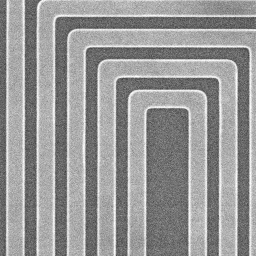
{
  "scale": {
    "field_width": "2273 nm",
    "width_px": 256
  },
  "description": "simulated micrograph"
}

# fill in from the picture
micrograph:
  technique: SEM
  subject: groups of lines, slits or small figures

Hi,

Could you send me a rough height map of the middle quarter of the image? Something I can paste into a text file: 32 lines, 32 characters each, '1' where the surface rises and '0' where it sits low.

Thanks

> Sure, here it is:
01111000011111111111111111111111
01111000011111111111111111111111
01111000011111111111111111111111
01111000011111000000000000000000
01111000011110000000000000000000
01111000011110000000000000000000
01111000011110000000000000000000
01111000011110000111111111111111
01111000011110001111111111111111
01111000011110001111111111111111
01111000011110001111111111111111
01111000011110001111100000000001
01111000011110001111000000000001
01111000011110001111000000000001
01111000011110001111000000000001
01111000011110001111000000000001
01111000011110001111000000000001
01111000011110001111000000000001
01111000011110001111000000000001
01111000011110001111000000000001
01111000011110001111000000000001
01111000011110001111000000000001
01111000011110001111000000000001
01111000011110001111000000000001
01111000011110001111000000000001
01111000011110001111000000000001
01111000011110001111000000000001
01111000011110001111000000000001
01111000011110001111000000000001
01111000011110001111000000000001
01111000011110001111000000000001
01111000011110001111000000000001